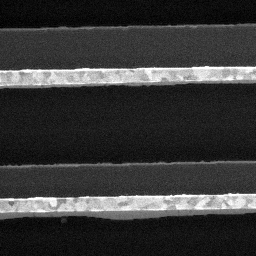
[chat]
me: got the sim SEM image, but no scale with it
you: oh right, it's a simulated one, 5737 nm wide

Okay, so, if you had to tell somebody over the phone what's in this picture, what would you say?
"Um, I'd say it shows lines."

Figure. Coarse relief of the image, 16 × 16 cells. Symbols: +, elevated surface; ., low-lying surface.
................
................
++++++++++++++++
++++++++++++++++
++++++++++++++++
................
................
................
................
................
++++++++++++++++
++++++++++++++++
++++++++++++++++
................
................
................